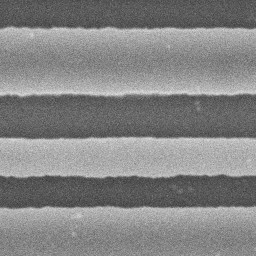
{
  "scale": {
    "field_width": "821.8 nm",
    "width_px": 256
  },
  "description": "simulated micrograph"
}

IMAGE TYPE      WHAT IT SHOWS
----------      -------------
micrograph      lines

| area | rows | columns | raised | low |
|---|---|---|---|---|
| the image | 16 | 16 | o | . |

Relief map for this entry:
................
................
oooooooooooooooo
oooooooooooooooo
oooooooooooooooo
oooooooooooooooo
................
................
................
oooooooooooooooo
oooooooooooooooo
................
................
oooooooooooooooo
oooooooooooooooo
oooooooooooooooo